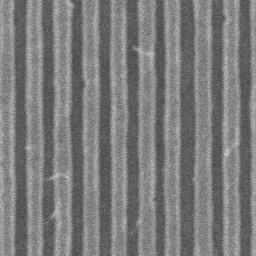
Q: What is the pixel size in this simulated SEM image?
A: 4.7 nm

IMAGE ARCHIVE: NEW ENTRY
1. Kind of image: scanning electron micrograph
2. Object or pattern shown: parallel lines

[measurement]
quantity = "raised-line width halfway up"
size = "13.3 px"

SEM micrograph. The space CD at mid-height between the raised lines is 71.1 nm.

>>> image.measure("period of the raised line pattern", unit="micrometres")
0.132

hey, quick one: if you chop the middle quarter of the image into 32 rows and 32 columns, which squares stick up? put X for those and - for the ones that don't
X----XXX----XXX----XXX----XXX---
X----XXX----XXX----XXX----XXX---
X----XXX----XXX----XXX----XXX---
X----XXX----XXX----XXX----XXX---
X-----XX----XXX----XXX----XXX---
X-----XX----XXX----XXX----XXX---
X----XXX----XXX----XXX----XX----
X----XXX----XXX----XXX----XX----
X----XXX----XXX----XXX----XXX---
X----XXX----XXX----XXX----XXX---
X----XXX----XXXX---XXX----XXX---
X----XXX----XXXX---XXX----XXX---
X----XXX----XXXX---XXX----XXX---
X----XXX----XXXX---XXX---XXXX---
X----XXX----XXXX---XXX---XXXX---
X----XXX----XXX----XXX----XXX---
X----XXX----XXX----XXX---XXXX---
X----XXX----XXX----XXX---XXXX---
X----XXX----XXX----XXX---XXXX---
X----XXX----XXX----XXX---XXXX---
X----XXX----XXX----XXX----XXX---
X----XXX----XXX----XXX----XXX---
XX---XXX----XXX----XXX----XXX---
XX---XXX----XXX----XXX----XXX---
XX---XXX----XXX----XXX----XXX---
X----XXX----XXX----XXX----XXX---
X----XXX----XXX----XXX---XXXX---
X----XXX----XXX----XXX----XXX---
X----XXX----XXX----XXX---XXXX---
X----XXX----XXX----XXX---XXXX---
X----XXX----XXX----XXX---XXXX---
X----XXX----XXX----XXX---XXXX---